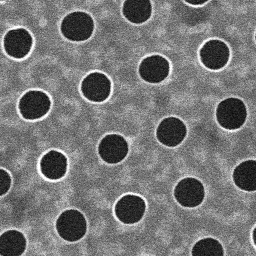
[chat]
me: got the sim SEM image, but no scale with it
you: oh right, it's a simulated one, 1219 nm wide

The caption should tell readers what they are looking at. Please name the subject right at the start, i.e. a regular array of holes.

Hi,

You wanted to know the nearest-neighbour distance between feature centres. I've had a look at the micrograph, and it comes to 291 nanometres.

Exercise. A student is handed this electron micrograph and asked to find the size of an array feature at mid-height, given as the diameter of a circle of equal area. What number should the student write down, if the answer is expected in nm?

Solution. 145